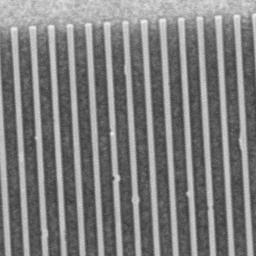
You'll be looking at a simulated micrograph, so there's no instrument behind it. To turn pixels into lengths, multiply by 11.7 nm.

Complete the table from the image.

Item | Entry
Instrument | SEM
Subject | parallel lines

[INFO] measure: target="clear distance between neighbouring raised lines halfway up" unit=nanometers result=161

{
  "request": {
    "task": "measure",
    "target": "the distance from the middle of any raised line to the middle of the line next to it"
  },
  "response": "218 nanometers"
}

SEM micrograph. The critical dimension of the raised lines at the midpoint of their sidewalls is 54.1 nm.